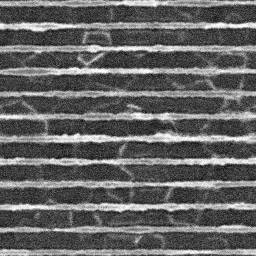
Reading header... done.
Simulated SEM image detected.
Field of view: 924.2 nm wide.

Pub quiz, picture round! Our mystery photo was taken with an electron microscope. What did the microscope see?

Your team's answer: parallel lines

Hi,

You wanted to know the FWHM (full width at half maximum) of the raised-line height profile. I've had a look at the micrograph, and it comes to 16.7 nm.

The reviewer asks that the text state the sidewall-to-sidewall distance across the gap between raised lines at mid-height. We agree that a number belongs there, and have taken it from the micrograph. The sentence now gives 0.0668 um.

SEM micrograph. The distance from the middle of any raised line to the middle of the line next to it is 81.8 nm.